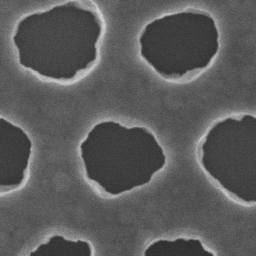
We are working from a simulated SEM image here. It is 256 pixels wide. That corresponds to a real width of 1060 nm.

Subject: holes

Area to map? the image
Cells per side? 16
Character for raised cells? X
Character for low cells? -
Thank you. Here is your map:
XXX--XXXXXXXXXXX
X-----XXX----XXX
X-----XXX-----XX
X-----XXX----XXX
XX---XXXXX--XXXX
XXXXXXXXXXXXXXXX
XXXXXXXXXXXXXXXX
XXXXXXXXXXXXXX--
--XXX-----XXX---
--XXX-----XXX---
--XXX-----XXX---
-XXXXX---XXXXX--
XXXXXXXXXXXXXXX-
XXXXXXXXXXXXXXXX
XXXXXXXXXXXXXXXX
XX----XXX----XXX